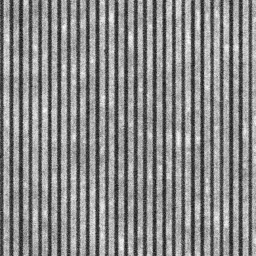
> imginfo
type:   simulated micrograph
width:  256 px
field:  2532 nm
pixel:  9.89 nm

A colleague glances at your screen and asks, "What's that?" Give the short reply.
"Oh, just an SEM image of parallel lines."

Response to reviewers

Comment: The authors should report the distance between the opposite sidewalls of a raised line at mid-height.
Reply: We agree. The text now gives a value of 48.2 nm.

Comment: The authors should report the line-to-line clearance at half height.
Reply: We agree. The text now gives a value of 39.6 nanometres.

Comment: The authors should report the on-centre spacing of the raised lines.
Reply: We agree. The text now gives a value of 94.7 nanometers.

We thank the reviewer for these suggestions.